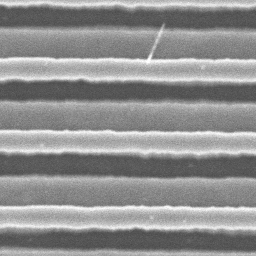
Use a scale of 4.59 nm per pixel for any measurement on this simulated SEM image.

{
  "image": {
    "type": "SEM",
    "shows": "lines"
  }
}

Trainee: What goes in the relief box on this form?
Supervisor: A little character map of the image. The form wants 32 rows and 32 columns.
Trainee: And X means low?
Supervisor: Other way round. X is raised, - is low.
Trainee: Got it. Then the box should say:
XXXXXXXXXXXXXXXXXXXXXXXXXXXXXXXX
--------------------------------
--------------------------------
--------------------------------
XXXXXXXXXXXXXXXXXXXXXXXXXXXXXXXX
XXXXXXXXXXXXXXXXXXXXXXXXXXXXXXXX
XXXXXXXXXXXXXXXXXXXXXXXXXXXXXXXX
XXXXXXXXXXXXXXXXXXXXXXXXXXXXXXXX
XXXXXXXXXXXXXXXXXXXXXXXXXXXXXXXX
XXXXXXXXXXXXXXXXXXXXXXXXXXXXXXXX
--------------------------------
--------------------------------
--------------------------------
XXXXXXXXXXXXXXXXXXXXXXXXXXXXXXXX
XXXXXXXXXXXXXXXXXXXXXXXXXXXXXXXX
XXXXXXXXXXXXXXXXXXXXXXXXXXXXXXXX
XXXXXXXXXXXXXXXXXXXXXXXXXXXXXXXX
XXXXXXXXXXXXXXXXXXXXXXXXXXXXXXXX
XXXXXXXXXXXXXXXXXXXXXXXXXXXXXXXX
--------------------------------
--------------------------------
--------------------------------
XXXXXXXXXXXXXXXXXXXXXXXXXX--XXXX
XXXXXXXXXXXXXXXXXXXXXXXXXXXXXXXX
XXXXXXXXXXXXXXXXXXXXXXXXXXXXXXXX
XXXXXXXXXXXXXXXXXXXXXXXXXXXXXXXX
XXXXXXXXXXXXXXXXXXXXXXXXXXXXXXXX
XXXXXXXXXXXXXXXXXXXXXXXXXXXXXXXX
----XX--XXX-XXXXX-XXXXXXXXXXXXXX
--------------------------------
--------------------------------
XXXXXXXXXXXXXXX-----------------